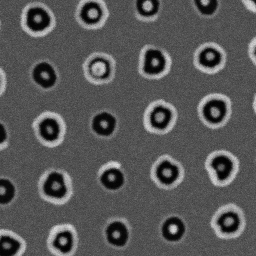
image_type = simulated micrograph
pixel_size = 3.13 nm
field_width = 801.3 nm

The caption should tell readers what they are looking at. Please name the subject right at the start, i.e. a regular array of ring-shaped grooves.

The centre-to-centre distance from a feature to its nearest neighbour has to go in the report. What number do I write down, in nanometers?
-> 171